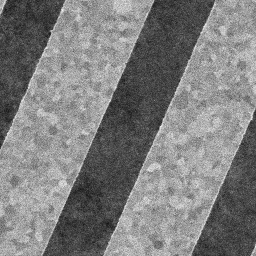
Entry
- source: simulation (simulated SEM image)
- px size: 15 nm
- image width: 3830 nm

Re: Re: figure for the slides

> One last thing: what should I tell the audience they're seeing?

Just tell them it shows one or a few lines or trenches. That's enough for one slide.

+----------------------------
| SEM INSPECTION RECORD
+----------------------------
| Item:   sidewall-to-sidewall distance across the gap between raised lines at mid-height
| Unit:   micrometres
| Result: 0.846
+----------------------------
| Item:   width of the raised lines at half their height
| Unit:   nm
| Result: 1200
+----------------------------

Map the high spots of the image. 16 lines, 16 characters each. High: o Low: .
....ooooo....ooo
...oooooo....ooo
...oooooo...oooo
...ooooo....oooo
..oooooo....oooo
..ooooo....ooooo
.oooooo....ooooo
.ooooo....oooooo
oooooo....ooooo.
ooooo....oooooo.
ooooo....ooooo..
ooooo...oooooo..
oooo....ooooo...
oooo....ooooo...
ooo....oooooo...
ooo....ooooo....